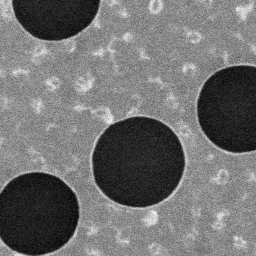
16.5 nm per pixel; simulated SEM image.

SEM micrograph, holes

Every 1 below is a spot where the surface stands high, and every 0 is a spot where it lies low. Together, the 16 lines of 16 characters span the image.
1000001111111111
1000001111111111
1110111111111111
1111111111111111
1111111111111100
1111111111111000
1111111111110000
1111111100110000
1111110000011000
1111110000001100
1111110000001111
0000110000011111
0000011000111111
0000011111111111
0000011111111111
1000111111111111